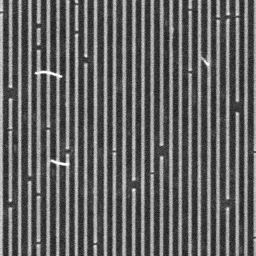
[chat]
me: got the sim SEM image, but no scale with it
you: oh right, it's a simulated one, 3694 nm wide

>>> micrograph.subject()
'parallel lines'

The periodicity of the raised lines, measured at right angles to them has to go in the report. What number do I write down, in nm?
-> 136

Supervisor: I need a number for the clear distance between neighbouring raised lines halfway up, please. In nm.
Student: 97.4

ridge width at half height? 36.1 nanometers